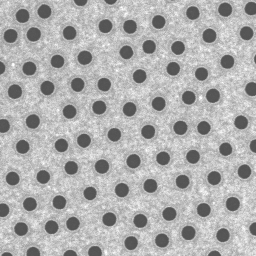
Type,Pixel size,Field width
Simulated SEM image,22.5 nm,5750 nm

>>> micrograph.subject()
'a regular array of holes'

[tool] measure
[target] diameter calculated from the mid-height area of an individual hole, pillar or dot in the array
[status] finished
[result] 14.2 px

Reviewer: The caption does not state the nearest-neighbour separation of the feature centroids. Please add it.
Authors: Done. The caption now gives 609 nanometers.